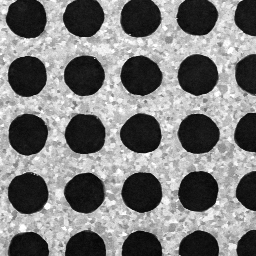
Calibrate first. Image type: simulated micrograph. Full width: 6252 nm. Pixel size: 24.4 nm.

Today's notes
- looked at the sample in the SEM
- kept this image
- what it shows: a regular array of holes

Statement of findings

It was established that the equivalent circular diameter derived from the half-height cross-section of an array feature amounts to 996 nm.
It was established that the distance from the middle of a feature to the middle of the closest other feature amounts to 1380 nm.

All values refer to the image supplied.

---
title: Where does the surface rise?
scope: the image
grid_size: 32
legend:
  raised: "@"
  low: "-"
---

@----@@@@---@@@@---@@@@----@@@--
@-----@@-----@@-----@@-----@@---
@-----@@-----@@-----@@-----@@---
@-----@@-----@@-----@@@----@@@--
@@---@@@@@-@@@@@---@@@@@@@@@@@@-
@@@@@@@@@@@@@@@@@@@@@@@@@@@@@@@@
@@@@@@@@@@@@@@@@@@@@@@@@@@@@@@@@
@@---@@@@---@@@@---@@@@---@@@@--
@-----@@-----@@-----@@-----@@---
@-----@@-----@@-----@@-----@@---
@-----@@-----@@-----@@-----@@@--
@@---@@@@---@@@@---@@@@---@@@@@-
@@@@@@@@@@@@@@@@@@@@@@@@@@@@@@@@
@@@@@@@@@@@@@@@@@@@@@@@@@@@@@@@@
@@---@@@@---@@@@@--@@@@@--@@@@--
@-----@@@----@@@----@@@----@@@--
@-----@@-----@@-----@@-----@@---
@-----@@-----@@-----@@-----@@---
@@---@@@@----@@@----@@@----@@@--
@@@@@@@@@@@@@@@@@@@@@@@@@@@@@@@@
@@@@@@@@@@@@@@@@@@@@@@@@@@@@@@@@
@@@@@@@@@@@@@@@@@@@@@@@@--@@@@@-
@@---@@@@----@@@----@@@----@@@--
@-----@@-----@@-----@@-----@@@--
@-----@@-----@@-----@@-----@@@--
@-----@@@----@@@----@@@----@@@--
@@@--@@@@@--@@@@@-@@@@@@@@@@@@@@
@@@@@@@@@@@@@@@@@@@@@@@@@@@@@@@@
@@@@@@@@@@@@@@@@@@@@@@@@@@@@@@@@
@@---@@@@---@@@@---@@@@----@@@--
@-----@@-----@@-----@@-----@@@--
@-----@@-----@@-----@@-----@@@--